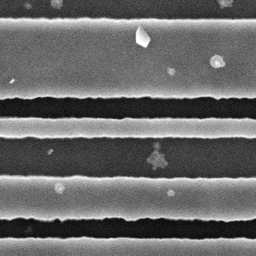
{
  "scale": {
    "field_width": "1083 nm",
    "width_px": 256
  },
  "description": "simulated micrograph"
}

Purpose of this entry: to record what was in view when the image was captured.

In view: lines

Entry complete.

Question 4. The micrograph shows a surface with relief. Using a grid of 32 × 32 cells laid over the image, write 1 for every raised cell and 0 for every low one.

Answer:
00000000000000000000000000000000
00000000000000000000000000000000
11110101111111000111000000100000
11111111111111111111111111111111
11111111111111111111111111111111
11111111111111111111111111111111
11111111111111111111111111111111
11111111111111111111111111111111
11111111111111111111111111111111
11111111111111111111111111111111
11111111111111111111111111111111
11111111111111111111111111111111
00000000000000000000000000000000
00000000000000000000000000000000
00000000000000000000000000000000
11111111111111111111111111111111
11111111111111111111111111111111
00000000000000000000000000000000
00000000000000000000000000000000
00000000000000000000000000000000
00000000000000000000000000000000
00000000000000000000000000000000
11111111111111111111111111111111
11111111111111111111111111111111
11111111111111111111111111111111
11111111111111111111111111111111
11111111111111111111111111111111
00000110000000001000000001111110
00000000000000000000000000000000
00000000000000000000000000000000
11111111111111111111111111111111
11111111111111111111111111111111